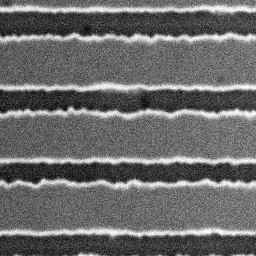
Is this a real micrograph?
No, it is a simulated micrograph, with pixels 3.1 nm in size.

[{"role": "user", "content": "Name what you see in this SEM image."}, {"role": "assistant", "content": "lines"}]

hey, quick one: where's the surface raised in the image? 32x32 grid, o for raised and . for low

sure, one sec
oooooooooooooooooooooooooooooooo
................................
................................
................................
......o..o...oo..o.......ooooo.o
oooooooooooooooooooooooooooooooo
oooooooooooooooooooooooooooooooo
oooooooooooooooooooooooooooooooo
oooooooooooooooooooooooooooooooo
oooooooooooooooooooooooooooooooo
oooooooooooooooooooooooooooooooo
................................
................................
................................
oooooooooooooooooooooooooooooooo
oooooooooooooooooooooooooooooooo
oooooooooooooooooooooooooooooooo
oooooooooooooooooooooooooooooooo
oooooooooooooooooooooooooooooooo
oooooooooooooooooooooooooooooooo
................................
................................
.....o.o.................o......
oooooooooooooooooooooooooooooooo
oooooooooooooooooooooooooooooooo
oooooooooooooooooooooooooooooooo
oooooooooooooooooooooooooooooooo
oooooooooooooooooooooooooooooooo
oooooooooooooooooooooooooooooooo
................................
................................
................................